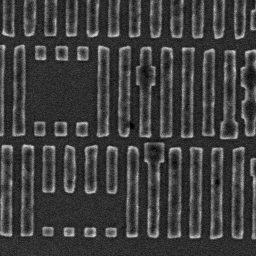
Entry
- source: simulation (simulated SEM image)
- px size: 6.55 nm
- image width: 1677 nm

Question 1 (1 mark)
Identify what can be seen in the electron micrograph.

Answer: wiring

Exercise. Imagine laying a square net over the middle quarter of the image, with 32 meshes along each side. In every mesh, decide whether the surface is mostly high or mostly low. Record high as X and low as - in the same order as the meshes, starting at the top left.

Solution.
---------XX---XX---XXX--XXX---XX
---------XX---XX--XXXXX-XXX---XX
---------XX---XX--XXXXX-XXX---XX
--------XXX---XX--XXXXX-XXX---XX
--------XXX---XX--XXXXX-XXX---XX
---------XX---XX---XXX--XXX---XX
---------XX---XX---XXX--XXX---XX
---------XX---XX---XXX--XXX---XX
--------XXX---XX---XXX--XXX---XX
--------XXX---XX---XXX--XXX---XX
--------XXX---XX---XXX--XXX---XX
--------XXX---XX---XXX--XXX---XX
--------XXX---XX---XXX--XXX---XX
--------XXX---XX---XXX--XXX--XXX
--------XXX---XX---XXX--XXX--XXX
X--XXX--XXX---XX---XXX--XXX--XXX
X--XXX--XXX---XX---XXX--XXX--XXX
X--XXX--XXX---XX---XXX--XXX--XXX
--------------------------------
--------------------------------
-------X------------XXXXX-------
XXX--XXX---XX---XX--XXXXX--XX---
XXX---XX---XX---XXX-XXXXX-XXX---
XXX---XX---XX---XXX-XXXXX-XXX---
XXX---XX---XX---XXX--XXX--XXX---
XXX--XXX---XX---XX---XXX--XXX---
XXX--XXX---XX---XX---XXX--XXX---
XXX--XXX---XX---XX---XXX--XXX---
XXX--XXX---XX---XX---XXX--XXX---
XXX--XXX---XX---XX---XXX--XXX---
XXX--XXX---XX---XX---XXX--XXX---
XX---XXX---XX---XX---XXX--XXX---